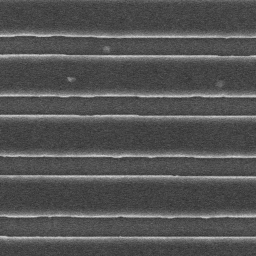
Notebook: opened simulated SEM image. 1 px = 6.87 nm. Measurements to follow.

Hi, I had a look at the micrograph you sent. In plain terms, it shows lines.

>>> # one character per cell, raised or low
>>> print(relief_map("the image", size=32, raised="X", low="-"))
XXXXXXXXXXXXXXXXXXXXXXXXXXXXXXXX
XXXXXXXXXXXXXXXXXXXXXXXXXXXXXXXX
XXXXXXXXXXXXXXXXXXXXXXXXXXXXXXXX
XXXXXXXXXXXXXXXXXXXXXXXXXXXXXXXX
XX--XXX-XXXXXXXXXXXXXXXXXXXXXXXX
--------------------------------
--------------------------------
XXXXXXXXXXXXXXXXXXXXXXXXXXXXXXXX
XXXXXXXXXXXXXXXXXXXXXXXXXXXXXXXX
XXXXXXXXXXXXXXXXXXXXXXXXXXXXXXXX
XXXXXXXXXXXXXXXXXXXXXXXXXXXXXXXX
XXXXXXXXXXXXXXXXXXXXXXXXXXXXXXXX
--------------------------------
--------------------------------
XXXXXXXXXX--XXXXX---------------
XXXXXXXXXXXXXXXXXXXXXXXXXXXXXXXX
XXXXXXXXXXXXXXXXXXXXXXXXXXXXXXXX
XXXXXXXXXXXXXXXXXXXXXXXXXXXXXXXX
XXXXXXXXXXXXXXXXXXXXXXXXXXXXXXXX
XXXXXXXXXXXXXXXXXXXXXXXXXXXXXXXX
--------------------------------
--------------------------------
XXXXXXXXXXXXXXXXXXXXXXXXXXXXXXXX
XXXXXXXXXXXXXXXXXXXXXXXXXXXXXXXX
XXXXXXXXXXXXXXXXXXXXXXXXXXXXXXXX
XXXXXXXXXXXXXXXXXXXXXXXXXXXXXXXX
XXXXXXXXXXXXXXXXXXXXXXXXXXXXXXXX
--------------------------------
--------------------------------
--------------------------------
XXXXXXXXXXXXXXXXXXXXXXXXXXXXXXXX
XXXXXXXXXXXXXXXXXXXXXXXXXXXXXXXX